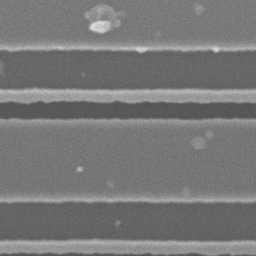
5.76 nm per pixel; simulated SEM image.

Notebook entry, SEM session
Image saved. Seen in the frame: lines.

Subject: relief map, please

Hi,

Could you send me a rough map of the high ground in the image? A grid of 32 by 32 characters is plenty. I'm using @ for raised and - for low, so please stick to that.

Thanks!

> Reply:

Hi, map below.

@@@@@@@@@@@@@@@@@@@@@@@@@@@@@@@@
@@@@@@@@@@@@@@@@@@@@@@@@@@@@@@@@
@@@@@@@@@@@@@@@@@@@@@@@@@@@@@@@@
@@@@@@@@@@@@@@@@@@@@@@@@@@@@@@@@
@@@@@@@@@@@@@@@@@@@@@@@@@@@@@@@@
@@@@@@@@@@@@@@@@@@@@@@@@@@@@@@@@
-----------------@--------------
--------------------------------
--------------------------------
--------------------------------
--------------------------------
@@@@@@@@@@@@@@@@@@@@@@@@@@@@@@@@
@@@@@@@@@@@@@@@@@@@@@@@@@@@@@@@@
--------------------------------
--------------------------------
@@@@@@@@@@@@@@@@@@@@@@@@@@@@@@@@
@@@@@@@@@@@@@@@@@@@@@@@@@@@@@@@@
@@@@@@@@@@@@@@@@@@@@@@@@@@@@@@@@
@@@@@@@@@@@@@@@@@@@@@@@@@@@@@@@@
@@@@@@@@@@@@@@@@@@@@@@@@@@@@@@@@
@@@@@@@@@@@@@@@@@@@@@@@@@@@@@@@@
@@@@@@@@@@@@@@@@@@@@@@@@@@@@@@@@
@@@@@@@@@@@@@@@@@@@@@@@@@@@@@@@@
@@@@@@@@@@@@@@@@@@@@@@@@@@@@@@@@
@@@@@@@@@@@@@@@@@@@@@@@@@@@@@@@@
--------------------------------
--------------------------------
--------------------------------
--------------------------------
--------------------------------
@@@@@@@@@@@@@@@@@@@@@@@@@@@@@@@@
@@@@@@@@@@@@@@@@@@@@@@@@@@@@@@@@